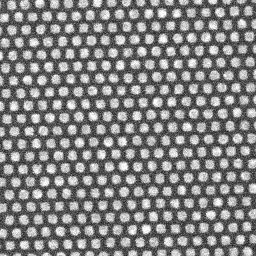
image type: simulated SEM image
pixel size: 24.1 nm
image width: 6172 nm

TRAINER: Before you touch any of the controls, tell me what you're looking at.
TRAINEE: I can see a regular array of raised bodies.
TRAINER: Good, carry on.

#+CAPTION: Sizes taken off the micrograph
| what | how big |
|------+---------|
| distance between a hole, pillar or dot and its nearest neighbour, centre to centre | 0.34 µm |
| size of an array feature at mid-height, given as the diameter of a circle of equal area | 8.52 px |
